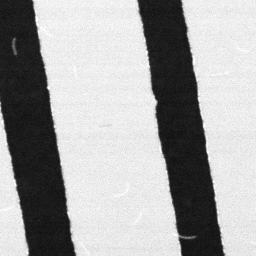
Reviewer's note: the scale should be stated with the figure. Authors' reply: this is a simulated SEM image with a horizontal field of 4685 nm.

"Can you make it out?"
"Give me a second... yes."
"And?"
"one or a few lines or trenches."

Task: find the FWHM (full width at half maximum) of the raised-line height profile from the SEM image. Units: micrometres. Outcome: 0.847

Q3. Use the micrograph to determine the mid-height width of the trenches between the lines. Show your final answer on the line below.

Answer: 1.86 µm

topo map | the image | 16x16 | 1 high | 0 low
1100000001100000
1100000001110000
1110000001110000
1110000001110000
1110000001110000
1110000001110000
1110000000111000
1110000000111000
1111000000111000
0111000000111000
0111000000111000
0111000000111000
0111000000011100
0111000000011100
0111000000011100
0011100000011100